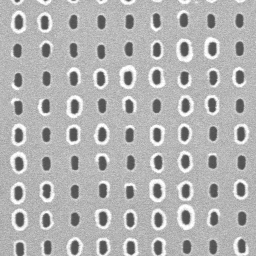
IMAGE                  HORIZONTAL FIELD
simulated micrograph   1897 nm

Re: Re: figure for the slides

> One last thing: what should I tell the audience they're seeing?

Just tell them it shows a regular array of holes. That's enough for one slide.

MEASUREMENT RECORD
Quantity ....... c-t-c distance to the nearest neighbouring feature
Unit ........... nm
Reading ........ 202